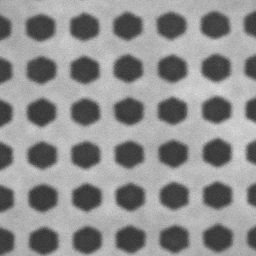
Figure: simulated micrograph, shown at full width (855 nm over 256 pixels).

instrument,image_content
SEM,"a regular array of holes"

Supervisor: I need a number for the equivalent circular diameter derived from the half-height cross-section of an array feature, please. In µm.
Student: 0.0993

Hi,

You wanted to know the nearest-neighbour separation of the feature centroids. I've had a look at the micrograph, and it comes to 142 nm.